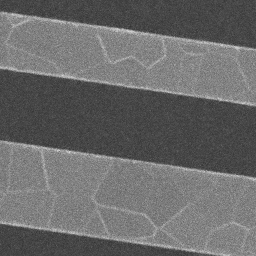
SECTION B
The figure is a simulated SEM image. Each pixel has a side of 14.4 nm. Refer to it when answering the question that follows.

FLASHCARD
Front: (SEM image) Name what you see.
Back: one or a few lines or trenches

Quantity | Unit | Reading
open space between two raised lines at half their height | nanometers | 1030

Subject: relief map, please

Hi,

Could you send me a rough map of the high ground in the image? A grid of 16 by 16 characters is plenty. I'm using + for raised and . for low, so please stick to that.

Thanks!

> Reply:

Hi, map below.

................
+++++...........
++++++++++++....
++++++++++++++++
..++++++++++++++
........++++++++
...............+
................
................
+++++...........
++++++++++++....
++++++++++++++++
++++++++++++++++
++++++++++++++++
....++++++++++++
...........+++++